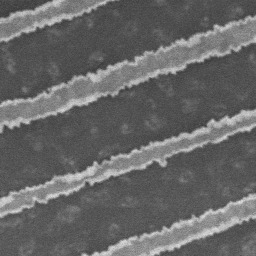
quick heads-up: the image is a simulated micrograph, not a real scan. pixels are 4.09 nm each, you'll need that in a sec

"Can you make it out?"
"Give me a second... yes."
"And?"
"one or a few lines or trenches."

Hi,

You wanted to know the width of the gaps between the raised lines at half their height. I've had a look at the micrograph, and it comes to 265 nm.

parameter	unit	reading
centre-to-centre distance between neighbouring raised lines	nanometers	342